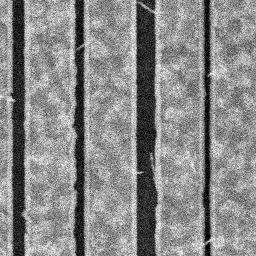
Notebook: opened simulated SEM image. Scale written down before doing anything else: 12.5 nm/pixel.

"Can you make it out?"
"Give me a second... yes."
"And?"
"one or a few lines or trenches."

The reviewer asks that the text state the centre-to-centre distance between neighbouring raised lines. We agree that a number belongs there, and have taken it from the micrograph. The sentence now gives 815 nm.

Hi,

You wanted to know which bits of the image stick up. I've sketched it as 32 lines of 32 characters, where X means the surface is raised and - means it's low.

X--XXXXXX--XXXXXX---XXXXX--XXXXX
X--XXXXXX--XXXXXX---XXXXX--XXXXX
X--XXXXXX--XXXXXX---XXXXX--XXXXX
X--XXXXXX--XXXXXX---XXXXX--XXXXX
X--XXXXXX--XXXXXX---XXXXX--XXXXX
X--XXXXXX--XXXXXX---XXXXX--XXXXX
X--XXXXXX--XXXXXX---XXXXX--XXXXX
X--XXXXXX--XXXXXX---XXXXX--XXXXX
X--XXXXXX--XXXXXX---XXXXX--XXXXX
X--XXXXXX--XXXXXX---XXXXX--XXXXX
X--XXXXXX--XXXXXX---XXXXX--XXXXX
X--XXXXXX--XXXXXX---XXXXX--XXXXX
X--XXXXXX--XXXXXX---XXXXX--XXXXX
X--XXXXXX--XXXXXX---XXXXX--XXXXX
X--XXXXXX--XXXXXX---XXXXX--XXXXX
X--XXXXXX--XXXXXX---XXXXX--XXXXX
X--XXXXXX--XXXXXX---XXXXX--XXXXX
X--XXXXXX--XXXXXX---XXXXX--XXXXX
X--XXXXXX--XXXXXX---XXXXX--XXXXX
X--XXXXXX--XXXXXX---XXXXX--XXXXX
X--XXXXXX--XXXXXX---XXXXX--XXXXX
X--XXXXXX--XXXXXX---XXXXX--XXXXX
X--XXXXXX--XXXXXX---XXXXX--XXXXX
X--XXXXXX--XXXXXX---XXXXX--XXXXX
X--XXXXXX--XXXXXX---XXXXX--XXXXX
X--XXXXXX--XXXXXX---XXXXX--XXXXX
X--XXXXXX--XXXXXX---XXXXX--XXXXX
X--XXXXXX--XXXXXX---XXXXX--XXXXX
X---XXXXX--XXXXXX---XXXXX--XXXXX
X--XXXXXX--XXXXXX---XXXXX-XXXXXX
X--XXXXXX--XXXXXX---XXXXXX-XXXXX
X--XXXXXX--XXXXXX---XXXXX--XXXXX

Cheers